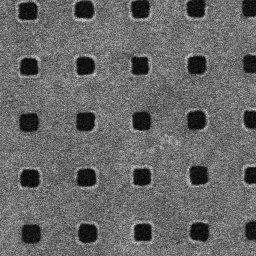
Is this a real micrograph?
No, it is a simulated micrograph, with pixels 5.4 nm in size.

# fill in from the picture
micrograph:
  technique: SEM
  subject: a regular array of holes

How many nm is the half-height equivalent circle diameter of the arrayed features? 109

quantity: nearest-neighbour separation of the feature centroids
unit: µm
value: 0.299